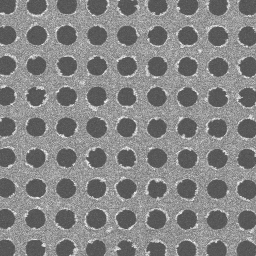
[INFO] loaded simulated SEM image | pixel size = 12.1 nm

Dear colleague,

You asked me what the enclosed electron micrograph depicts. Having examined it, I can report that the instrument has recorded a regular array of holes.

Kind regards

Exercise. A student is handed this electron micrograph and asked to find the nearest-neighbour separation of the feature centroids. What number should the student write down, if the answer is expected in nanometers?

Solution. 362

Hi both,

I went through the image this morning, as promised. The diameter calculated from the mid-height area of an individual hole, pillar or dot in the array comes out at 0.234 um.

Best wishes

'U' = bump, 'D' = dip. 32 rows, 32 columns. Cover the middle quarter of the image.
DDDUUUDDDDDUUDDDDDUUUDDDDDUUUDDD
DDDUUUDDDDUUUUDDDDUUUDDDDDUUDDDD
DDUUUUUDDDUUUUDDDUUUUUDDDUUUUDDD
UUUUUUUUUUUUUUUUUUUUUUUUUUUUUUUU
UUUUUUUUUUUUUUUUUUUUUUUUUUUUUUUU
UUUUUUUUUUUUUUUUUUUUUUUUUUUUUUUU
DDDUUUDDDDUUUUDDDUUUUUDDDUUUUDDD
DDDUUUDDDDDUUDDDDDUUUDDDDUUUUDDD
DDDUUUDDDDDUUDDDDDUUUDDDDDUUDDDD
DDDUUUDDDDUUUUDDDDUUUDDDDUUUUDDD
UUUUUUUDDUUUUUUDDUUUUUDDUUUUUUDD
UUUUUUUUUUUUUUUUUUUUUUUUUUUUUUUU
UUUUUUUUUUUUUUUUUUUUUUUUUUUUUUUU
DUUUUUUDDUUUUUUDUUUUUUUUUUUUUUUU
DDDUUUDDDDUUUUDDDDUUUDDDDUUUUDDD
DDDUUUDDDDDUUDDDDDUUUDDDDDUUDDDD
DDDUUUDDDDDUUDDDDDUUUDDDDDUUDDDD
DDUUUUDDDDUUUUDDDUUUUDDDDUUUUDDD
UUUUUUUUDUUUUUUUUUUUUUUUUUUUUUUD
UUUUUUUUUUUUUUUUUUUUUUUUUUUUUUUU
UUUUUUUUUUUUUUUUUUUUUUUUUUUUUUUU
DDUUUUUUDDUUUUUDUUUUUUDDDUUUUUDU
DDDUUUDDDDDUUDDDDDUUUDDDDDUUUDDD
DDDUUUDDDDDUUDDDDDUUUDDDDDUUDDDD
DDDUUUDDDDUUUDDDDDUUUDDDDDUUUDDD
DDUUUUUDDDUUUUUDDUUUUUDDDUUUUDDD
UUUUUUUUUUUUUUUUUUUUUUUUUUUUUUUU
UUUUUUUUUUUUUUUUUUUUUUUUUUUUUUUU
UUUUUUUUUUUUUUUUUUUUUUUUUUUUUUUU
DDUUUUDDDDUUUUDDDUUUUDDDDUUUUDDD
DDDUUUDDDDDUUDDDDDUUUDDDDDUUDDDD
DDDUUUDDDDUUUDDDDDUUUDDDDDUUDDDD